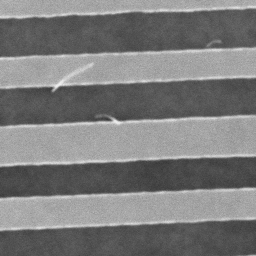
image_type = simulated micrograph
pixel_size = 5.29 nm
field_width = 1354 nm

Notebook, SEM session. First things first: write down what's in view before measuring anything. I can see lines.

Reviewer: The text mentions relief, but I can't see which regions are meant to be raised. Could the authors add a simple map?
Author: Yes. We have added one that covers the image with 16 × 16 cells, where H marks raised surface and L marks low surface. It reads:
HHHHHHHHHHHHHHHH
LLLLLLLLLLLLLLLL
LLLLLLLLLLLLLLLL
LLLHHHHHHHHHHHHH
HHHHHHHHHHHHHHHH
LLLLLLLLLLLLLLLL
LLLLLLLLLLLLLLLL
LLLLLLLLLLHHHHHH
HHHHHHHHHHHHHHHH
HHHHHHHHHHHHHHHH
LLLLLLLLLLLLLLLL
LLLLLLLLLLLLLLLL
HHHHHHHHHHHHHHHH
HHHHHHHHHHHHHHHH
LLLLLLLLLLLLLLLL
LLLLLLLLLLLLLLLL